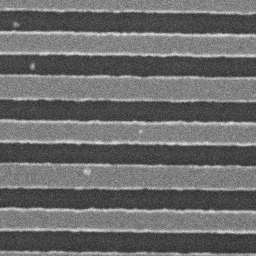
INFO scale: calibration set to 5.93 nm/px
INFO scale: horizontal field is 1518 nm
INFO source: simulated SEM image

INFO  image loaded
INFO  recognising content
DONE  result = lines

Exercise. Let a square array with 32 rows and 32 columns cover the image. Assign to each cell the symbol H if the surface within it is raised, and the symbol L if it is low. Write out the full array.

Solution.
HHHHHHHHHHHHHHHHHHHHHHHHHHHHHHHH
LLLLLLLLLLLLLLHLLLHHHHHHHHHHHHHH
LLLLLLLLLLLLLLLLLLLLLLLLLLLLLLLL
LLLLLLLLLLLLLLLLLLLLLLLLLLLLLLLL
HHHHHHHHHHHHHHHHHHHHHHHHHHHHHHHH
HHHHHHHHHHHHHHHHHHHHHHHHHHHHHHHH
HHHHHHHHHHHHHHHHHHHHHHHHHHHHHHHH
LLLLLLLLLLLLLLLLLLLLLLLLLLLLLLLL
LLLLLLLLLLLLLLLLLLLLLLLLLLLLLLLL
HHHHHLHHLLLLLLLLLLLLLLLLLLLLLLLL
HHHHHHHHHHHHHHHHHHHHHHHHHHHHHHHH
HHHHHHHHHHHHHHHHHHHHHHHHHHHHHHHH
LLLLLLLLLHHLLLHHHHHHHHHHHHHHHHHH
LLLLLLLLLLLLLLLLLLLLLLLLLLLLLLLL
LLLLLLLLLLLLLLLLLLLLLLLLLLLLLLLL
HHHHHHHHHHHHHHHHHHHHHHHHHHHHHHHH
HHHHHHHHHHHHHHHHHHHHHHHHHHHHHHHH
HHHHHHHHHHHHHHHHHHHHHHHHHHHHHHHH
LLLLLLLLLLLLLLLLLLLLLLLLLLLLLLLL
LLLLLLLLLLLLLLLLLLLLLLLLLLLLLLLL
HHHHHHHLLLLLLLLLLLLLLLLLLLLLLLLL
HHHHHHHHHHHHHHHHHHHHHHHHHHHHHHHH
HHHHHHHHHHHHHHHHHHHHHHHHHHHHHHHH
LLLLLLLLLHHHHHHHHHHHHHHHHHHHHHHH
LLLLLLLLLLLLLLLLLLLLLLLLLLLLLLLL
LLLLLLLLLLLLLLLLLLLLLLLLLLLLLLLL
HHHHHHHHHHHHHHHHHHHHHHHHHHHHHHHH
HHHHHHHHHHHHHHHHHHHHHHHHHHHHHHHH
HHHHHHHHHHHHHHHHHHHHHHHHHHHHHHHH
LLLLLLLLLLLLLLLLLLLLLLLLLLLLLLLL
LLLLLLLLLLLLLLLLLLLLLLLLLLLLLLLL
HHHHHLHHLLLLLLLLLLLLLLLLLLLLLLLL